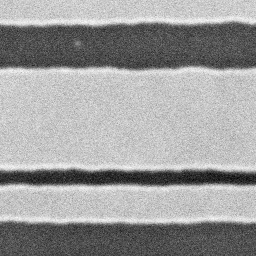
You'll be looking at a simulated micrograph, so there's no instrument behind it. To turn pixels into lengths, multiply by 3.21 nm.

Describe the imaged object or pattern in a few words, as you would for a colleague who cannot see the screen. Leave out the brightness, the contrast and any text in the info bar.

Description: lines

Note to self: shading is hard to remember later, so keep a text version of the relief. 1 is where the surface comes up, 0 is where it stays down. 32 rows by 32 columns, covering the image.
11111111111111111111111111111111
11111111111111111111111111111111
11111111111111111111111111111011
00000000000000000000000000000000
00000000000000000000000000000000
00000000000000000000000000000000
00000000000000000000000000000000
00000000000000000000000000000000
00000000000000000000000000000000
11111111111111111111111111111111
11111111111111111111111111111111
11111111111111111111111111111111
11111111111111111111111111111111
11111111111111111111111111111111
11111111111111111111111111111111
11111111111111111111111111111111
11111111111111111111111111111111
11111111111111111111111111111111
11111111111111111111111111111111
11111111111111111111111111111111
11111111111111111111111111111111
00000000000000000000000000000000
00000000000000000000000000000000
11111111111111111111111111111111
11111111111111111111111111111111
11111111111111111111111111111111
11111111111111111111111111111111
00011111111111111111111110000111
00000000000000000000000000000000
00000000000000000000000000000000
00000000000000000000000000000000
00000000000000000000000000000000